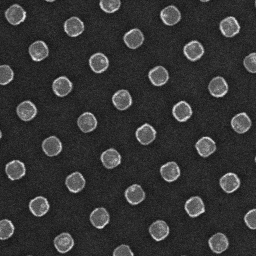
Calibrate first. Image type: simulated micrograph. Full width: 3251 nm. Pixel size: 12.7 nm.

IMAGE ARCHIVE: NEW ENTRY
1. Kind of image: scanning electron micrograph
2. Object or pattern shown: a regular array of raised bodies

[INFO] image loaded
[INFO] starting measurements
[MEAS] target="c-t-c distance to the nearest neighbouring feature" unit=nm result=541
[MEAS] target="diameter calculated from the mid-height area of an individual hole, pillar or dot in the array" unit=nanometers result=242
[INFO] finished